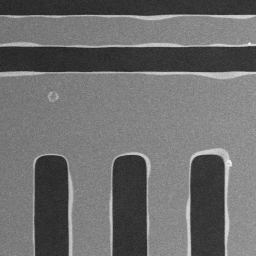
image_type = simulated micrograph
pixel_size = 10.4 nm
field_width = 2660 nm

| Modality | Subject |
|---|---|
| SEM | groups of lines, slits or small figures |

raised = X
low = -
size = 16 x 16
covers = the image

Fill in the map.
----------------
XXXXXXXXXXXXXXXX
XXXXXXXXXXXXXXXX
----------------
----------------
XXXXXXXXXXXXXXXX
XXXXXXXXXXXXXXXX
XXXXXXXXXXXXXXXX
XXXXXXXXXXXXXXXX
XXXXXXXXXXXXX-XX
XX--XXX--XXX--XX
XX--XXX--XXX--XX
XX--XXX--XXX--XX
XX--XXX--XXX--XX
XX--XXX--XXX--XX
XX--XXX--XXX--XX